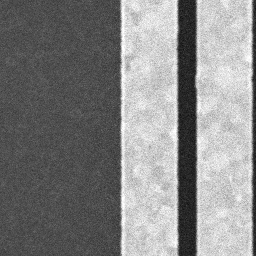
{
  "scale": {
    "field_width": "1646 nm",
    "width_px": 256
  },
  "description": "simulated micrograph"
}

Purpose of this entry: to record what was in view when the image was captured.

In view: one or a few lines or trenches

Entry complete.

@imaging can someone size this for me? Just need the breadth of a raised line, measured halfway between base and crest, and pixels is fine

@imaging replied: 54.7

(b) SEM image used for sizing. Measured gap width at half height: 129 nm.